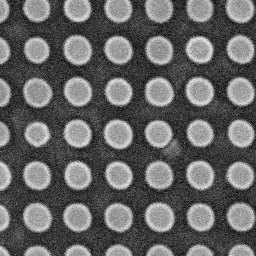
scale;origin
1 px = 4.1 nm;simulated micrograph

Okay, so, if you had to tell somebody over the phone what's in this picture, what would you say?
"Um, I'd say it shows a regular array of raised bodies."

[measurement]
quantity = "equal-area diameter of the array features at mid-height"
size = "107 nm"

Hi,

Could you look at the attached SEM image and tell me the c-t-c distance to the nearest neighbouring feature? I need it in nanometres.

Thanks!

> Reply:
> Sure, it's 166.